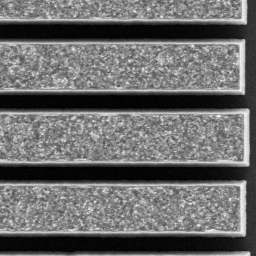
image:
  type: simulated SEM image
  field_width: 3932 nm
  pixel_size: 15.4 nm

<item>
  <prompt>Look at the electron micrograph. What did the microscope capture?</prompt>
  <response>one or a few lines or trenches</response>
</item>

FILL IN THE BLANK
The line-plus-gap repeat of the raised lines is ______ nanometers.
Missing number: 1090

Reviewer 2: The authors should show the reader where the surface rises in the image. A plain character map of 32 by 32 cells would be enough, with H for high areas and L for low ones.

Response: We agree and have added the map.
HHHHHHHHHHHHHHHHHHHHHHHHHHHHHHLL
HHHHHHHHHHHHHHHHHHHHHHHHHHHHHHHL
HHHHHHHHHHHHHHHHHHHHHHHHHHHHHHLL
LLLLLLLLLLLLLLLLLLLLLLLLLLLLLLLL
LLLLLLLLLLLLLLLLLLLLLLLLLLLLLLLL
HHHHHHHHHHHHHHHHHHHHHHHHHHHHHHLL
HHHHHHHHHHHHHHHHHHHHHHHHHHHHHHLL
HHHHHHHHHHHHHHHHHHHHHHHHHHHHHHLL
HHHHHHHHHHHHHHHHHHHHHHHHHHHHHHLL
HHHHHHHHHHHHHHHHHHHHHHHHHHHHHHLL
HHHHHHHHHHHHHHHHHHHHHHHHHHHHHHLL
HHHHHHHHHHHHHHHHHHHHHHHHHHHHHHLL
LLLLLLLLLLLLLLLLLLLLLLLLLLLLLLLL
LLLLLLLLLLLLLLLLLLLLLLLLLLLLLLLL
HHHHHHHHHHHHHHHHHHHHHHHHHHHHHHHL
HHHHHHHHHHHHHHHHHHHHHHHHHHHHHHHL
HHHHHHHHHHHHHHHHHHHHHHHHHHHHHHHL
HHHHHHHHHHHHHHHHHHHHHHHHHHHHHHHL
HHHHHHHHHHHHHHHHHHHHHHHHHHHHHHHL
HHHHHHHHHHHHHHHHHHHHHHHHHHHHHHHL
HHHHHHHHHHHHHHHHHHHHHHHHHHHHHHHL
LLLLLLLLLLLLLLLLLLLLLLLLLLLLLLLL
LLLLLLLLLLLLLLLLLLLLLLLLLLLLLLLL
HHHHHHHHHHHHHHHHHHHHHHHHHHHHHHLL
HHHHHHHHHHHHHHHHHHHHHHHHHHHHHHLL
HHHHHHHHHHHHHHHHHHHHHHHHHHHHHHLL
HHHHHHHHHHHHHHHHHHHHHHHHHHHHHHLL
HHHHHHHHHHHHHHHHHHHHHHHHHHHHHHLL
HHHHHHHHHHHHHHHHHHHHHHHHHHHHHHLL
LLLLLLLLLLLLLLLLLLLLLLLLLLLLLLLL
LLLLLLLLLLLLLLLLLLLLLLLLLLLLLLLL
LLLLLLLLLLLLLLLLLLLLLLLLLLLLLLLL